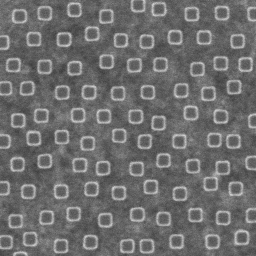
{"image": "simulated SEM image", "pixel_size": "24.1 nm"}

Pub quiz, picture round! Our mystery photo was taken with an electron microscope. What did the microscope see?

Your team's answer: a regular array of raised bodies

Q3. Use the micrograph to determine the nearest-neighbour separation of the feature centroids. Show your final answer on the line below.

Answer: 617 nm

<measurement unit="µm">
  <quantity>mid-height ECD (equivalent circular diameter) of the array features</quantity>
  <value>0.358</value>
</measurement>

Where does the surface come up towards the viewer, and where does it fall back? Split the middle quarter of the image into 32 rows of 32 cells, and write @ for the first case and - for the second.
-@@@-----@@@----@@@----@@@------
-@@@------------@@@----@@------@
-@@@----------------------------
--------------------------------
--------------------------------
-----@@---------------------@@@-
@----@@@----@@@----@@@------@@@-
@----@@@----@@@----@@@------@@@-
@----@@@----@@@-----@@----------
--------------------------------
--------------------------------
--@@@-----@-------------------@@
--@@@---@@@@----@@@-----------@@
--@@@---@@@@----@@@@--@@@-----@@
---------@@-----@@@---@@@-------
----------------------@@@-------
-------------@@-----------------
@-----------@@@-----------------
@----@@-----@@@----@@@-----@@@--
@---@@@@------@----@@@-----@@@--
----@@@@-----------@@@-----@@@--
-----@@-------------------------
------------------------@@------
-----------------------@@@------
--@@@@---@@------------@@@-----@
--@@@@--@@@------@@@---@@@-----@
--@@@---@@@------@@@-----------@
--------@@@------@@-------------
--------------------------------
--------------------@@@---------
@----@@@------------@@@---------
@----@@@----@@@-----@@@----@@@@-